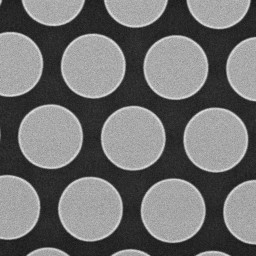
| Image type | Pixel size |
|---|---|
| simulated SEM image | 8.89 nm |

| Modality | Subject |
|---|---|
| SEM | an array of small figures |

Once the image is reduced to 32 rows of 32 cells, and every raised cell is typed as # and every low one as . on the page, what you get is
...########..########..########.
...#######....######....#######.
....#####.....######.....#####..
..........................##....
###.......###........##.........
####.....######....######.....##
#####...#######...#######....###
#####...########..########..####
#####...########..########..####
#####...#######...########..####
#####...#######....######....###
###......#####.....######.....##
...............................#
.....###.......###........#.....
...######.....######....######..
...#######...#######...#######..
..########...########..########.
..########...########..########.
...#######...#######...########.
...#######...#######....######..
....####......#####.....######..
..........................##....
###.......###........##.........
####....######.....######....###
#####...#######...#######...####
#####..########...########..####
#####..########...########..####
#####...#######...#######...####
####....#######...#######...####
###......####......#####.....###
...............................#
....####.......###........##....